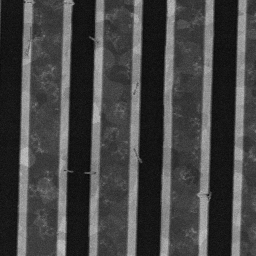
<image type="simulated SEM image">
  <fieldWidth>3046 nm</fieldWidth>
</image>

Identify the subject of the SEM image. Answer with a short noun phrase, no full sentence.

one or a few lines or trenches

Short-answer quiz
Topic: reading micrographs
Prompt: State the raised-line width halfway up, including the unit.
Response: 464 nm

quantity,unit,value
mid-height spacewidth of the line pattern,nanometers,382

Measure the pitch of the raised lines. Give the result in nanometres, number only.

846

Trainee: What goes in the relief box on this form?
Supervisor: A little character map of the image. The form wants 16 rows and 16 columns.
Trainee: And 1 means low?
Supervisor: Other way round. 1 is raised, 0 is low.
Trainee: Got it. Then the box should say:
0011001110011001
0011001110011001
0011001110011001
0011001110011001
0011001100011001
0011001110011001
0011001100111001
0011001100011001
0011001100111001
0011001100111001
0011001100111001
0111001100111001
0111001100111001
0111001100111001
0111001100111001
0111001100111001